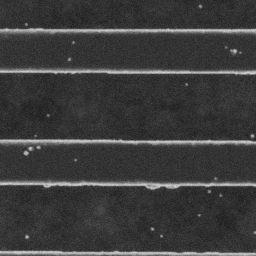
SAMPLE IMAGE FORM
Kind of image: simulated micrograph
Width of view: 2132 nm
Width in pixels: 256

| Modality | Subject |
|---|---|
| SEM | lines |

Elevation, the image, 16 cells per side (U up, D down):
DDDDDDDDDDDDDDDD
DDDDDDDDDDDDDDDD
UUUUUUUUUUUUUUUU
UUUUUUUUUUUUUUUU
UUUUUUUUUUUUUUUU
DDDDDDDDDDDDDDDD
DDDDDDDDDDDDDDDD
DDDDDDDDDDDDDDDD
DDDDDDDDDDDDDDDD
UUUUUUUUUUUUUUUU
UUUUUUUUUUUUUUUU
DUUUUUUUUUUUUUUU
DDDDDDDDDDDDDDDD
DDDDDDDDDDDDDDDD
DDDDDDDDDDDDDDDD
DDDDDDDDDDDDDDDD